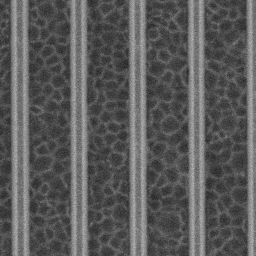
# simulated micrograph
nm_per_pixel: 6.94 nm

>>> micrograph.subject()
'parallel lines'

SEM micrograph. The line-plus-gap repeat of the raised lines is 408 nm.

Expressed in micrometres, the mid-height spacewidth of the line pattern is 0.328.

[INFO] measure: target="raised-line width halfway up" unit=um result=0.0816